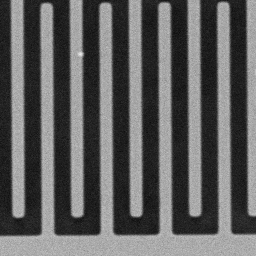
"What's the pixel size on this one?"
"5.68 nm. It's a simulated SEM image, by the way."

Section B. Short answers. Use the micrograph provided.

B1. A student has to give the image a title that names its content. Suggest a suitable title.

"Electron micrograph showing groups of lines, slits or small figures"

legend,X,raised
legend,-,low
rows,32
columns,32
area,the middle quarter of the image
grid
--XXX----XXX----XXX-----XXX----X
--XXX----XXX----XXX-----XXX----X
--XXX----XXX----XXX-----XXX----X
--XXX----XXX----XXX-----XXX----X
--XXX----XXX----XXX-----XXX----X
--XXX----XXX----XXX-----XXX----X
--XXX----XXX----XXX-----XXX----X
--XXX----XXX----XXX-----XXX----X
--XXX----XXX----XXX-----XXX----X
--XXX----XXX----XXX-----XXX----X
--XXX----XXX----XXX-----XXX----X
--XXX----XXX----XXX-----XXX----X
--XXX----XXX----XXX-----XXX----X
--XXX----XXX----XXX-----XXX----X
--XXX----XXX----XXX-----XXX----X
--XXX----XXX----XXX-----XXX----X
--XXX----XXX-----XX-----XXX----X
--XXX----XXX-----XX-----XXX----X
--XXX----XXX-----XX-----XXX----X
--XXX----XXX-----XX-----XXX----X
--XXX----XXX-----XX-----XXX----X
--XXX----XXX-----XX-----XXX----X
--XXX----XXX-----XX-----XXX----X
--XXX----XXX-----XX-----XXX----X
--XXX----XXX-----XX-----XXX----X
--XXX----XXX-----XX-----XXX----X
--XXX----XXX-----XX-----XXX----X
--XXX----XXX-----XX-----XXX----X
--XXX----XXX-----XX-----XXX----X
--XXX----XXX-----XX-----XXX----X
--XXX----XXX-----XX-----XXX----X
--XXX----XXX-----XX-----XXX----X